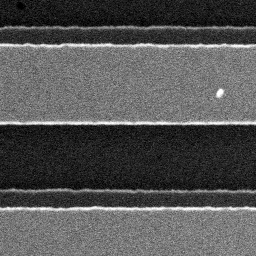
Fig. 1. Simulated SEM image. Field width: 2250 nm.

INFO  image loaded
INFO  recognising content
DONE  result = lines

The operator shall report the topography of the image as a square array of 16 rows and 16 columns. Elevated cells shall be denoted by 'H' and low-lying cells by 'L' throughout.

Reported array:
LLLLLLLLLLLLLLLL
LLLLLLLLLLLLLLLL
LLLLLLLLLLLLLLLL
HHHHHHHHHHHHHHHH
HHHHHHHHHHHHHHHH
HHHHHHHHHHHHHHHH
HHHHHHHHHHHHHHHH
HHHHHHHHHHHHHHHH
LLLLLLLLLLLLLLLL
LLLLLLLLLLLLLLLL
LLLLLLLLLLLLLLLL
LLLLLLLLLLLLLLLL
LLLLLLLLLLLLLLLL
HHHHHHHHHHHHHHHH
HHHHHHHHHHHHHHHH
HHHHHHHHHHHHHHHH